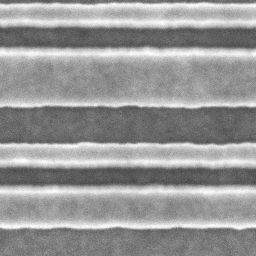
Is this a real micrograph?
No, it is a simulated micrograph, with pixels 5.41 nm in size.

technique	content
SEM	lines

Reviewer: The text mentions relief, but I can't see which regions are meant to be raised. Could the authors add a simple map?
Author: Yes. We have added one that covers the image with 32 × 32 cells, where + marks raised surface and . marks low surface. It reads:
.......+......+..+....+++++.....
++++++++++++++++++++++++++++++++
++++++++++++++++++++++++++++++++
................................
................................
................................
++++++........+++++..++++.......
++++++++++++++++++++++++++++++++
++++++++++++++++++++++++++++++++
++++++++++++++++++++++++++++++++
++++++++++++++++++++++++++++++++
++++++++++++++++++++++++++++++++
++++++++++++++++++++++++++++++++
................................
................................
................................
................................
................................
++++++++++++++++++++++++++++++++
++++++++++++++++++++++++++++++++
................................
................................
................................
................................
++++++++++++++++++++++++++++++++
++++++++++++++++++++++++++++++++
++++++++++++++++++++++++++++++++
++++++++++++++++++++++++++++++++
................................
................................
................................
................................